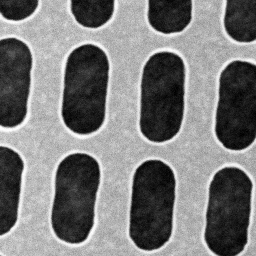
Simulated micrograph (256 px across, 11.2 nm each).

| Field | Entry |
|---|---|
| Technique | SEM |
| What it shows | holes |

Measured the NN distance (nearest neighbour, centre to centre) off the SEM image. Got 0.866 um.